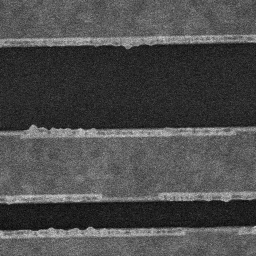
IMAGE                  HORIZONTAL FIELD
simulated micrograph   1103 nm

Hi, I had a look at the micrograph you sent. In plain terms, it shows one or a few lines or trenches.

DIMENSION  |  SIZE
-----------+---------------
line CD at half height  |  307 nm